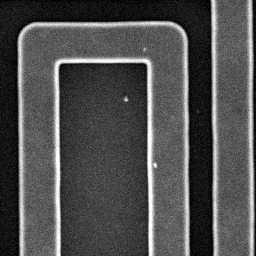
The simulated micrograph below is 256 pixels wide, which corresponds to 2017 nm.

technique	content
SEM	groups of lines, slits or small figures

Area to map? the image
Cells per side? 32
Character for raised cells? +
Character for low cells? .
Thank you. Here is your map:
...........................++++.
...........................++++.
...........................++++.
...++++++++++++++++++++....++++.
...++++++++++++++++++++....++++.
..+++++++++++++++++++++....++++.
..+++++++++++++++++++++....++++.
..+++++++++++++++++++++....+++++
..+++++............++++....+++++
..+++++............++++....++++.
..+++++............++++....++++.
..+++++............++++....++++.
..+++++............++++....++++.
...++++............++++....++++.
...++++............++++....++++.
...++++............++++....++++.
...++++............++++....++++.
...++++............++++....++++.
...++++............++++....+++++
...++++............++++....+++++
...++++............++++....+++++
...++++............++++....+++++
...++++............++++....+++++
...++++............++++....+++++
...++++............++++....+++++
...++++............++++....+++++
...++++............++++....+++++
...++++............++++....+++++
...++++............++++....+++++
...++++............++++....+++++
...++++............++++....+++++
...++++............++++....+++++